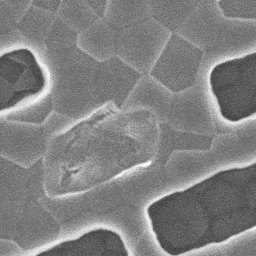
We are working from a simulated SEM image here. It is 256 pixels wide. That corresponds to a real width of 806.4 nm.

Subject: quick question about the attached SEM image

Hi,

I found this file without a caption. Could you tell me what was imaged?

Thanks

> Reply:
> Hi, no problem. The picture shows holes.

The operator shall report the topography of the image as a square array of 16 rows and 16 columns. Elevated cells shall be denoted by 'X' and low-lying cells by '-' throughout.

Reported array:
XXXXXXXXXXXXXXXX
XXXXXXXXXXXXXXXX
XXXXXXXXXXXXXXXX
--XXXXXXXXXXXXX-
---XXXXXXXXXX---
---XXXXXXXXXX---
-XXXXXXXXXXXXX--
XXXXXXXXXXXXXX-X
XXXXXXXXXXXXXXXX
XXXXXXXXXXXXXXXX
XXXXXXXXXXXXXXX-
XXXXXXXXXXXX----
XXXXXXXXXX------
XXXXXXXXX-------
XXXXX--XXX-----X
XXX-----XX--XXXX